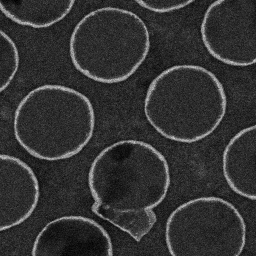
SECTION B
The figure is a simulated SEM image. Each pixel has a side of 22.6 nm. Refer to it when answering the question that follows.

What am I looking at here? raised bodies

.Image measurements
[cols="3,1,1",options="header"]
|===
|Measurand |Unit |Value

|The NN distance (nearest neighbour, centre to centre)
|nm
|2170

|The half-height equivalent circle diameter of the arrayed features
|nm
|1730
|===